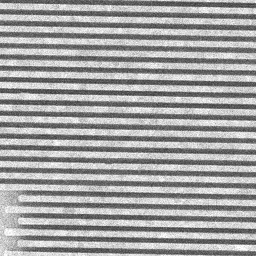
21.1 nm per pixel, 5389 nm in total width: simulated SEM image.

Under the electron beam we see parallel lines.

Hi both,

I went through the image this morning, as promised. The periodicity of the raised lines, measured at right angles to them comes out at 0.237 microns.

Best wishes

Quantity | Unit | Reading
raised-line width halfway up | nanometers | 129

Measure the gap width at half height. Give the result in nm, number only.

110